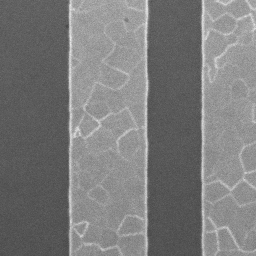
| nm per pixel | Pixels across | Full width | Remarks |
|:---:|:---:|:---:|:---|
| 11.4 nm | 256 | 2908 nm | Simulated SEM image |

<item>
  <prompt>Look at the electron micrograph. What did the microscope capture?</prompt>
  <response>wiring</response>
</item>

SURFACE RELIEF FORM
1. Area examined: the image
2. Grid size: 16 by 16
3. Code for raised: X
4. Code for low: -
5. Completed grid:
----XXXXX----XXX
----XXXXX----XXX
----XXXXX----XXX
----XXXXX----XXX
----XXXXX----XXX
----XXXXX----XXX
----XXXXX----XXX
----XXXXX----XXX
----XXXXX----XXX
----XXXXX----XXX
----XXXXX----XXX
----XXXXX----XXX
----XXXXX----XXX
----XXXXX----XXX
----XXXXX----XXX
----XXXXX----XXX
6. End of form